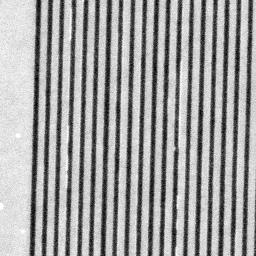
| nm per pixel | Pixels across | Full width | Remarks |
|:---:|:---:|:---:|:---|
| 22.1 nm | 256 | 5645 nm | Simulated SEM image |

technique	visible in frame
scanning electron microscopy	parallel lines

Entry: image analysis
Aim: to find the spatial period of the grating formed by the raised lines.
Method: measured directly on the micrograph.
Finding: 0.26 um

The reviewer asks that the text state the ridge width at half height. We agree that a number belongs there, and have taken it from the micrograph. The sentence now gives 135 nm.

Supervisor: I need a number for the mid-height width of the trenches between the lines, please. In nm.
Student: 124